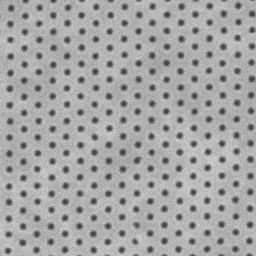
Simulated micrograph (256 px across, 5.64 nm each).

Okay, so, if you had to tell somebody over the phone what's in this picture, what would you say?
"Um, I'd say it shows a regular array of holes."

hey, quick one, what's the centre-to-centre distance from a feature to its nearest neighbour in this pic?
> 89 nm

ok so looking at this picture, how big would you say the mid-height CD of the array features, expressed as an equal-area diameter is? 42.2 nm